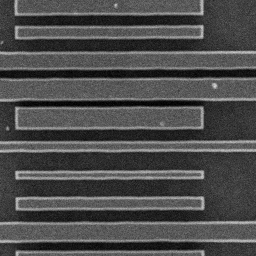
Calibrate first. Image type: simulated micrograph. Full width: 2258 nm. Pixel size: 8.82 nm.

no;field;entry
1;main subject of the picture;groups of lines, slits or small figures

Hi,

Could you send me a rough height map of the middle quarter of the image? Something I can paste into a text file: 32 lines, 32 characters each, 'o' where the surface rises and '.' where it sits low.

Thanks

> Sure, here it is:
oooooooooooooooooooooooooooooooo
................................
................................
................................
oooooooooooooooooooooooooooooooo
oooooooooooooooooooooooooooooooo
oooooooooooooooooooooooooooooooo
oooooooooooooooooooooooooooooooo
oooooooooooooooooooooooooooooooo
................................
................................
oooooooooooooooooooooooooooooooo
oooooooooooooooooooooooooooooooo
oooooooooooooooooooooooooooooooo
oooooooooooooooooooooooooooooooo
oooooooooooooooooooooooooooooooo
................................
................................
................................
.ooo......oooooo.ooooooo..oooooo
oooooooooooooooooooooooooooooooo
oooooooooooooooooooooooooooooooo
................................
................................
................................
................................
................................
oooooooooooooooooooooooooooooooo
oooooooooooooooooooooooooooooooo
................................
................................
................................